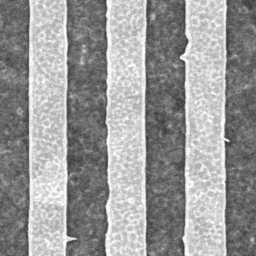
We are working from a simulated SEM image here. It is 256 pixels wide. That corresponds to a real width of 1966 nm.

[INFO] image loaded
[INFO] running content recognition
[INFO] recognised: one or a few lines or trenches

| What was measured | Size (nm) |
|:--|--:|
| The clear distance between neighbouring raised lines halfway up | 321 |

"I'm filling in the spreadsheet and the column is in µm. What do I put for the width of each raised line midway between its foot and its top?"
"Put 0.279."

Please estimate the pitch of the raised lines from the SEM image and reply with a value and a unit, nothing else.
606 nanometres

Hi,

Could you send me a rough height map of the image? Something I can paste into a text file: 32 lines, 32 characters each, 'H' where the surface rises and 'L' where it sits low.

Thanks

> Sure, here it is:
LLLLHHHHLLLLLLHHHHLLLLLHHHHHLLLL
LLLLHHHHLLLLLHHHHHLLLLLHHHHHLLLL
LLLLHHHHLLLLLHHHHHLLLLLHHHHHLLLL
LLLLHHHHLLLLLHHHHHLLLLLHHHHHLLLL
LLLLHHHHLLLLLHHHHHLLLLLHHHHHLLLL
LLLLHHHHLLLLLLHHHHLLLLLLHHHHLLLL
LLLLHHHHLLLLLHHHHHLLLLLHHHHHLLLL
LLLLHHHHLLLLLHHHHHLLLLLHHHHHLLLL
LLLLHHHHLLLLLHHHHHLLLLLHHHHHLLLL
LLLLHHHHLLLLLHHHHHLLLLLHHHHHLLLL
LLLLHHHHLLLLLHHHHHLLLLLHHHHHLLLL
LLLLHHHHLLLLLHHHHHLLLLLHHHHHLLLL
LLLLHHHHLLLLLLHHHHLLLLLHHHHHLLLL
LLLLHHHHLLLLLHHHHHLLLLLHHHHHLLLL
LLLLHHHHLLLLLHHHHHLLLLLHHHHHLLLL
LLLLHHHHLLLLLHHHHHLLLLLHHHHHLLLL
LLLLHHHHLLLLLLHHHHLLLLLHHHHHLLLL
LLLLHHHHLLLLLHHHHHLLLLLHHHHHLLLL
LLLLHHHHLLLLLHHHHHLLLLLHHHHHLLLL
LLLLHHHHLLLLLLHHHHLLLLLHHHHHLLLL
LLLLHHHHLLLLLLHHHHLLLLLHHHHHLLLL
LLLLHHHHLLLLLLHHHHLLLLLHHHHHLLLL
LLLLHHHHLLLLLLHHHHLLLLLHHHHHLLLL
LLLLHHHHLLLLLLHHHHLLLLLHHHHHLLLL
LLLLHHHHLLLLLLHHHHLLLLLHHHHHLLLL
LLLLHHHHLLLLLHHHHHLLLLLHHHHHLLLL
LLLLHHHHLLLLLHHHHHLLLLLHHHHHLLLL
LLLLHHHHLLLLLLHHHHLLLLLHHHHHLLLL
LLLLHHHHLLLLLLHHHHLLLLLHHHHHLLLL
LLLLHHHHLLLLLHHHHHLLLLLHHHHHLLLL
LLLLHHHHLLLLLHHHHHLLLLLHHHHHLLLL
LLLLHHHHLLLLLHHHHHLLLLLHHHHHLLLL